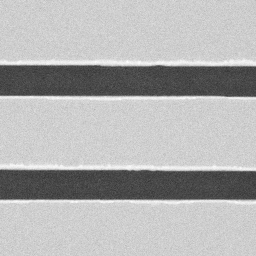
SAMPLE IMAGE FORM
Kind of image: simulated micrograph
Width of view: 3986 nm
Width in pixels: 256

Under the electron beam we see lines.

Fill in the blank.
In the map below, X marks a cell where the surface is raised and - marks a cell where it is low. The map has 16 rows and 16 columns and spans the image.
XXXXXXXXXXXXXXXX
XXXXXXXXXXXXXXXX
XXXXXXXXXXXXXXXX
XXXXXXXXXXXXXXXX
----------------
----------------
XXXXXXXXXXXXXXXX
XXXXXXXXXXXXXXXX
XXXXXXXXXXXXXXXX
XXXXXXXXXXXXXXXX
XXXXXXXXXXXXXXXX
----------------
----------------
XXXXXXXXXXXXXXXX
XXXXXXXXXXXXXXXX
XXXXXXXXXXXXXXXX